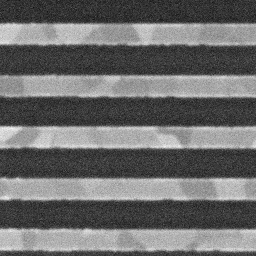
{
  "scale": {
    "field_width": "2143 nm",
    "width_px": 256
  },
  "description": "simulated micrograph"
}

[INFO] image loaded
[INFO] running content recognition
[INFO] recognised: lines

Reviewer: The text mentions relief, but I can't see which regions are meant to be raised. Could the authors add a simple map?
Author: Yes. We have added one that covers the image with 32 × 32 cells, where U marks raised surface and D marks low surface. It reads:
DDDDDDDDDDDDDDDDDDDDDDDDDDDDDDDD
DDDDDDDDDDDDDDDDDDDDDDDDDDDDDDDD
DDDDDDDDDDDDDDDDDDDDDDDDDDDDDDDD
UUUUUUUUUUUUUUUUUUUUUUUUUUUUUUUU
UUUUUUUUUUUUUUUUUUUUUUUUUUUUUUUU
DDUDDUDUDDDDUUUUUUUUUUDUUUUUUUUU
DDDDDDDDDDDDDDDDDDDDDDDDDDDDDDDD
DDDDDDDDDDDDDDDDDDDDDDDDDDDDDDDD
DDDDDDDDDDDDDDDDDDDDDDDDDDDDDDDD
UDDDDDUDDDDDDDDDDDDDDDDDDDDDDDDD
UUUUUUUUUUUUUUUUUUUUUUUUUUUUUUUU
UUUUUUUUUUUUUUUUUUUUUUUUUUUUUUUU
DDDDDDDDDDDDDDDDDDDDDDDDDDDDDDDD
DDDDDDDDDDDDDDDDDDDDDDDDDDDDDDDD
DDDDDDDDDDDDDDDDDDDDDDDDDDDDDDDD
DDDDDDDDDDDDDDDDDDDDDDDDDDDDDDDD
UUUUUUUUUUUUUUUUUUUUUUUUUUUUUUUU
UUUUUUUUUUUUUUUUUUUUUUUUUUUUUUUU
DDDDDDDDDDDDDDDDDDDDDDDDDDDDDDDD
DDDDDDDDDDDDDDDDDDDDDDDDDDDDDDDD
DDDDDDDDDDDDDDDDDDDDDDDDDDDDDDDD
DDDDDDDDDDDDDDDDDDDDDDDDDDDDDDDD
UUUUUUUUUUUUUUUUUUUUUUUUUUUUUUUU
UUUUUUUUUUUUUUUUUUUUUUUUUUUUUUUU
UUUUUUUUUUUUUUUUUUUUUUUUUUUUUUUU
DDDDDDDDDDDDDDDDDDDDDDDDDDDDDDDD
DDDDDDDDDDDDDDDDDDDDDDDDDDDDDDDD
DDDDDDDDDDDDDDDDDDDDDDDDDDDDDDDD
DDDDDDDDDDDDDDDDDDDDDDDDDDDDDDDD
UUUUUUUUUUUUUUUUUUUUUUUUUUUUUUUU
UUUUUUUUUUUUUUUUUUUUUUUUUUUUUUUU
DDDDDDDDDDDDDDDDDDDDDDDDDDDDDDDD